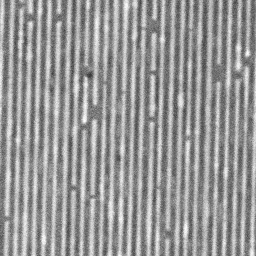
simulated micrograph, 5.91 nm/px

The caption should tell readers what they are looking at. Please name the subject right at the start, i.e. parallel lines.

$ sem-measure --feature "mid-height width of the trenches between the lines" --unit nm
36.2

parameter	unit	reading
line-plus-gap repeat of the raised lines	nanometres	55.9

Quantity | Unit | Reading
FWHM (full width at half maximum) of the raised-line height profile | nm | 20.7